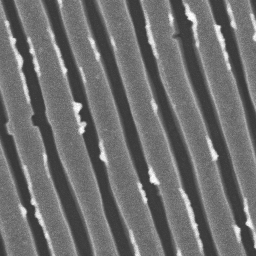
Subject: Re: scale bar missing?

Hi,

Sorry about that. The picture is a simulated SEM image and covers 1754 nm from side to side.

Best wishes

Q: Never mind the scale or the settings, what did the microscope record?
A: parallel lines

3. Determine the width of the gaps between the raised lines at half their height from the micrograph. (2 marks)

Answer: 85.9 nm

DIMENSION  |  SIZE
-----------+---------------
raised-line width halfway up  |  185 nm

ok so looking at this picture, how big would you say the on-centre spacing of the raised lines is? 276 nm